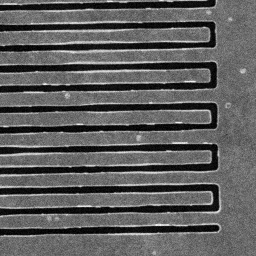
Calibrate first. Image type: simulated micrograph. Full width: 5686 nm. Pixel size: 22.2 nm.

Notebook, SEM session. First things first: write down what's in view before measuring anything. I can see groups of lines, slits or small figures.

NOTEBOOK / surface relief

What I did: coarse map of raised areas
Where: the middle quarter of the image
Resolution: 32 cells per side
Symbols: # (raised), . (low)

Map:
................................
............................####
################################
################################
############################....
................................
................................
################################
################################
################################
................................
................................
################################
################################
################################
................................
................................
################################
################################
################################
................................
................................
################################
################################
################################
####............................
................................
################################
################################
################################
................................
................................